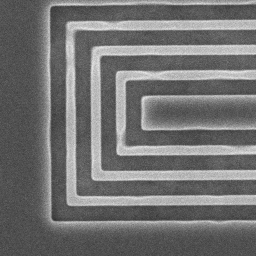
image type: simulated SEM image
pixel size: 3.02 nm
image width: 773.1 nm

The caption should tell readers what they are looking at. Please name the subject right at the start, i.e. groups of lines, slits or small figures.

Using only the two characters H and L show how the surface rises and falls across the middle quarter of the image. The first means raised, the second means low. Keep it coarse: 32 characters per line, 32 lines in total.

LHHLLLLHHLLLLLLLLLLLLLLLLLLLLLLL
LHHLLLLHHLLLLLLLLLLLLLLLLLLLLLLL
LHHLLLLHHLLLLHHHHHHHHHHHHHHHHHHH
LHHLLLLHHLLLLHHHHHHHHHHHHHHHHHHH
LHHLLLLHHLLLLHHLLLLLLLLLLLLLLLLL
LHHLLLLHHLLLLHHLLLLLLLLLLLLLLLLL
LHHLLLLHHLLLLHHLLLLLLLLLLLLLLLLL
LHHLLLLHHLLLLHHLLLLLLLLLLLLLLLLL
LHHLLLLHHLLLLHHLLLLLHHHHHHHHHHHH
LHHLLLLHHLLLLHHLLLLLHHHHHHHHHHHH
LHHLLLLHHLLLLHHLLLLLHHHHHHHHHHHH
LHHLLLLHHLLLLHHLLLLLHHHHHHHHHHHH
LHHLLLLHHLLLLHHLLLLLHHHHHHHHHHHH
LHHLLLLHHLLLLHHLLLLLHHHHHHHHHHHH
LHHLLLLHHLLLLHHLLLLLHHHHHHHHHHHH
LHHLLLLHHLLLLHHLLLLHHHHHHHHHHHHH
LHHLLLLHHLLLLHHLLLLLLLLLLLLLLLLL
LHHLLLLHHLLLLHHLLLLLLLLLLLLLLLLL
LHHLLLLHHLLLLHHLLLLLLLLLLLLLLLLL
LHHLLLLHHLLLLHHLLLLLLLLLLLLLLLLL
LHHLLLLHHLLLLHHLLLLLLLLLLLLLLLLL
LHHLLLLHHLLLLHHHHHHHHHHHHHHHHHHH
LHHLLLLHHLLLLHHHHHHHHHHHHHHHHHHH
LHHLLLLHHLLLLLLLLLLLLLLLLLLLLLLL
LHHLLLLHHLLLLLLLLLLLLLLLLLLLLLLL
LHHLLLLHHLLLLLLLLLLLLLLLLLLLLLLL
LHHLLLLHHHLLLLLLLLLLLLLLLLLLLLLL
LHHLLLLHHHHHHHHHHHHHHHHHHHHHHHHH
LHHLLLLHHHHHHHHHHHHHHHHHHHHHHHHH
LHHLLLLLLLLLLLLLLLLLLLLLLLLLLLLL
LHHLLLLLLLLLLLLLLLLLLLLLLLLLLLLL
LHHLLLLLLLLLLLLLLLLLLLLLLLLLLLLL